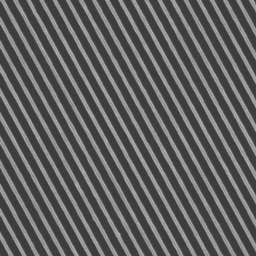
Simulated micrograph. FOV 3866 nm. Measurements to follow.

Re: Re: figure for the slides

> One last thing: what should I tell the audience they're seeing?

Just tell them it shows parallel lines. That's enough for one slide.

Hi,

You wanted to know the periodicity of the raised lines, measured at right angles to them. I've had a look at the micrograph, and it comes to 174 nm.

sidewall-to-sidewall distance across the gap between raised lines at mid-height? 122 nanometres